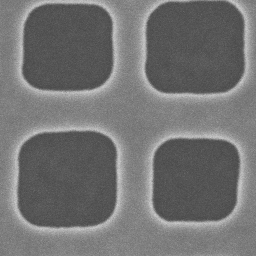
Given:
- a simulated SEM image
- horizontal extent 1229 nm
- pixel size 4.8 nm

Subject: holes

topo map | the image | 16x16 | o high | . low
oo....oooo.....o
oo.....oo......o
o......oo......o
o......oo......o
o......oo......o
oo....oooo.....o
oooooooooooooooo
oooooooooooooooo
oo.....ooooooooo
o......ooo.....o
o......ooo.....o
o......ooo.....o
o......ooo.....o
o......ooo....oo
oooooooooooooooo
oooooooooooooooo